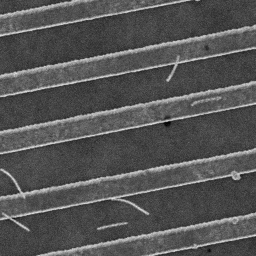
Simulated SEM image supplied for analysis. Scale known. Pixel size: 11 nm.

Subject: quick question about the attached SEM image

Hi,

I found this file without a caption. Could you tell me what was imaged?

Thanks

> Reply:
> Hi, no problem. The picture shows lines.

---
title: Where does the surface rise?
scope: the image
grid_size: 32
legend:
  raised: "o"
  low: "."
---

.......oooooooooooooo...........
...ooooooooooooo................
ooooooooooo.....................
ooooo..........................o
..........................oooooo
.....................ooooooooooo
...............oooooooooooooo...
..........oooooooooooooo........
.....oooooooooooooo.............
oooooooooooooo..................
ooooooooo......................o
ooo.......................oooooo
.....................ooooooooooo
................ooooooooooooo...
...........ooooooooooooo........
.....oooooooooooooo.............
oooooooooooooo..................
ooooooooo.......................
oooo............................
............................oooo
.......................ooooooooo
.................oooooooooooooo.
............oooooooooooooo......
.......oooooooooooooo...........
.ooooooooooooooo................
ooooooooooo.....................
ooooo...........................
............................oooo
.......................ooooooooo
..................oooooooooooooo
.............ooooooooooooo......
........ooooooooooooo...........